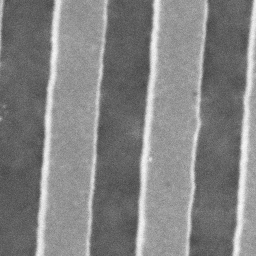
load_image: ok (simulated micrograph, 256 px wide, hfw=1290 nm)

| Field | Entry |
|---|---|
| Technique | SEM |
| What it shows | lines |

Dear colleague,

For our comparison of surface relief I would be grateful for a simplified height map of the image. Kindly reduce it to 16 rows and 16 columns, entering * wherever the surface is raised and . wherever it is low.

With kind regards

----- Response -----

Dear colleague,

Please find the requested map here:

...****...***...
...****...***...
...****...***...
...***...****...
...***...****...
...***...***...*
...***...***...*
...***...***...*
...***...***...*
...***...***...*
...***...***...*
...***...***...*
...***...***...*
...***...***...*
..****...***...*
..****...***...*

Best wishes